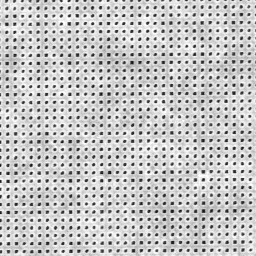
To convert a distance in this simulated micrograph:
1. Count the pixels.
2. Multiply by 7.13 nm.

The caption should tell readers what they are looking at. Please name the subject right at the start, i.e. a regular array of holes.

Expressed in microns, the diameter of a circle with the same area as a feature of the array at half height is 0.029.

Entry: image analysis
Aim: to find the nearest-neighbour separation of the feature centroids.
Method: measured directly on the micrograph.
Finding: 54.1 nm